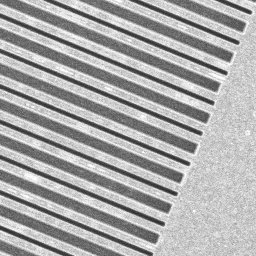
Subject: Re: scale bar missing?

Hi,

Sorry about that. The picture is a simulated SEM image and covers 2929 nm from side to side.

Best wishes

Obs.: parallel lines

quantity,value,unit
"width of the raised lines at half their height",106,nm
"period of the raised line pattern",187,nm